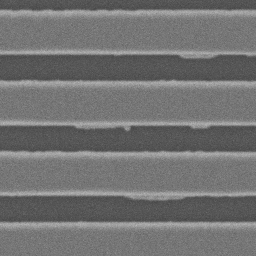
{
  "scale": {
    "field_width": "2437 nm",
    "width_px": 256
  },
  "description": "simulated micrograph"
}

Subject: lines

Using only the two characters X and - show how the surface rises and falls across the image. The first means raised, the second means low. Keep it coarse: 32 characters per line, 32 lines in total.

--------------------------------
XXXXXXXXXXXXXXXXXXXXXXXXXXXXXXXX
XXXXXXXXXXXXXXXXXXXXXXXXXXXXXXXX
XXXXXXXXXXXXXXXXXXXXXXXXXXXXXXXX
XXXXXXXXXXXXXXXXXXXXXXXXXXXXXXXX
XXXXXXXXXXXXXXXXXXXXXXXXXXXXXXXX
XXXXXXXXXXXXXXXXXXXXXXXXXXXXXXXX
--------------------------------
--------------------------------
--------------------------------
XXXXXXXXXXXXXXXXXXXXXXXXXXXXXXXX
XXXXXXXXXXXXXXXXXXXXXXXXXXXXXXXX
XXXXXXXXXXXXXXXXXXXXXXXXXXXXXXXX
XXXXXXXXXXXXXXXXXXXXXXXXXXXXXXXX
XXXXXXXXXXXXXXXXXXXXXXXXXXXXXXXX
XXXXXXXXXXXXXXXXXXXXXXXXXXXXXXXX
--------------------------------
--------------------------------
--------------------------------
XXXXXXXXXXXXXXXXXXXXXXXXXXXXXXXX
XXXXXXXXXXXXXXXXXXXXXXXXXXXXXXXX
XXXXXXXXXXXXXXXXXXXXXXXXXXXXXXXX
XXXXXXXXXXXXXXXXXXXXXXXXXXXXXXXX
XXXXXXXXXXXXXXXXXXXXXXXXXXXXXXXX
--------------------------------
--------------------------------
--------------------------------
--------------------------------
XXXXXXXXXXXXXXXXXXXXXXXXXXXXXXXX
XXXXXXXXXXXXXXXXXXXXXXXXXXXXXXXX
XXXXXXXXXXXXXXXXXXXXXXXXXXXXXXXX
XXXXXXXXXXXXXXXXXXXXXXXXXXXXXXXX